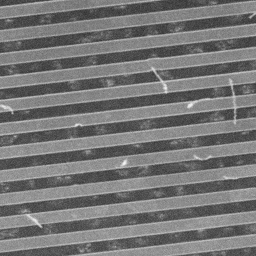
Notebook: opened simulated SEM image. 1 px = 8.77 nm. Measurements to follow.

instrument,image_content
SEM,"parallel lines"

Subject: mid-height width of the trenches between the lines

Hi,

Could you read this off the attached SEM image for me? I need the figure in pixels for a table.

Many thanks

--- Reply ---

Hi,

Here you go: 11.6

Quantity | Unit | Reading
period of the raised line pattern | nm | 204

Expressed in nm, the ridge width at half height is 101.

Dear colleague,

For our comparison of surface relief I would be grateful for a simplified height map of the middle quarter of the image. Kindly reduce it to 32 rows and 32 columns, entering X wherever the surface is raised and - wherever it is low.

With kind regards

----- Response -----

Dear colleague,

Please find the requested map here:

---------XXXXXXXXXXXXXXXXXXXXXXX
XXXXXXXXXXXXXXXXXXXXXXX---------
XXXXXXXXXXXXXXX-----------------
XXXXXXX-------------------------
------------------------XXXXXXXX
----------------XXXXXXXXXXXXXXXX
-------XXXXXXXXXXXXXXXXXXXXXXXX-
XXXXXXXXXXXXXXXXXXXXXXX---------
XXXXXXXXXXXXXX------------------
XXXXX---------------------------
-----------------------XXXXXXXXX
---------------XXXXXXXXXXXXXXXXX
------XXXXXXXXXXXXXXXXXXXXXXXX--
XXXXXXXXXXXXXXXXXXXXX-----------
XXXXXXXXXXXXX-------------------
XXX----------------------------X
----------------------XXXXXXXXXX
-------------XXXXXXXXXXXXXXXXXXX
-----XXXXXXXXXXXXXXXXXXXXXXX----
XXXXXXXXXXXXXXXXXXXX------------
XXXXXXXXXXX---------------------
XXX--------------------------XXX
---------------------XXXXXXXXXXX
------------XXXXXXXXXXXXXXXXXXXX
---XXXXXXXXXXXXXXXXXXXXXXXX-----
XXXXXXXXXXXXXXXXXX--------------
XXXXXXXXXX----------------------
X---------------------------XXXX
-------------------XXXXXXXXXXXXX
-----------XXXXXXXXXXXXXXXXXXXXX
--XXXXXXXXXXXXXXXXXXXXXXXX------
XXXXXXXXXXXXXXXXX---------------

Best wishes